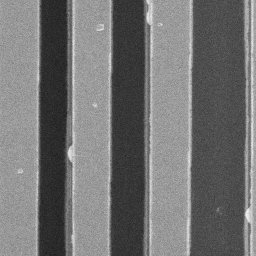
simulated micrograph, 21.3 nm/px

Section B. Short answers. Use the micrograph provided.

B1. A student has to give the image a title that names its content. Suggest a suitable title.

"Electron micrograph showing lines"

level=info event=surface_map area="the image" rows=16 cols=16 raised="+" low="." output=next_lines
++..+++..+++...+
++..+++..+++...+
++..+++..+++...+
++..+++..+++...+
++..+++..+++...+
++..+++..+++...+
++..+++..+++...+
++..+++..+++...+
++..+++..+++...+
++..+++..+++...+
++..+++..+++...+
++..+++..+++...+
++..+++..+++...+
++..+++..+++...+
++..+++..+++...+
++..+++..+++...+